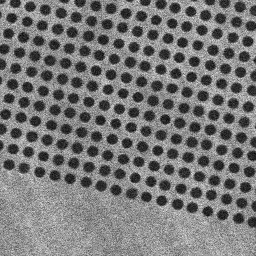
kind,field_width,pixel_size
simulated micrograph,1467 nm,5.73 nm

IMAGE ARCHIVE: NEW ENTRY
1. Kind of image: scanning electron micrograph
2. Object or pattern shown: a regular array of holes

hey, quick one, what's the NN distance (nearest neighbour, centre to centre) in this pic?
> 87.9 nm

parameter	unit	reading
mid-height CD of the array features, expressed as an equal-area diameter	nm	64.1